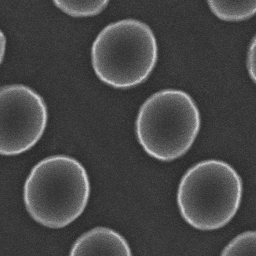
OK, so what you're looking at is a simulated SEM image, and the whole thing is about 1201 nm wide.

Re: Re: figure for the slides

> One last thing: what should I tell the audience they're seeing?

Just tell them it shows raised bodies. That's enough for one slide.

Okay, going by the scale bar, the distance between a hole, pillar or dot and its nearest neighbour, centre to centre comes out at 386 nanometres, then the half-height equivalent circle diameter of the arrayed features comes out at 302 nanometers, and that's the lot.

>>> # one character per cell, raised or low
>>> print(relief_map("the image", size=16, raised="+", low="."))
....++.......+++
.......++.......
......++++......
......++++......
......+++.......
................
+++......+++....
+++......+++....
++.......+++....
+........++.....
..+++.......++..
..+++......++++.
..+++......++++.
..+++.......++..
......+.........
.....+++......++